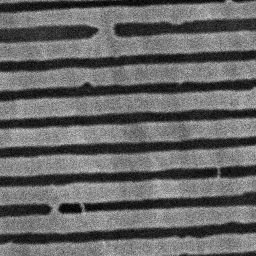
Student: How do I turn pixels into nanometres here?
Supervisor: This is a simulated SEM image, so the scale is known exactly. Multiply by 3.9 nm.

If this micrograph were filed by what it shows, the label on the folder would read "parallel lines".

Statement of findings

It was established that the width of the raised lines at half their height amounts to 75.9 nanometres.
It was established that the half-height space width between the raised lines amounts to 38 nanometres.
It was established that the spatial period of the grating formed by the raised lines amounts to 114 nm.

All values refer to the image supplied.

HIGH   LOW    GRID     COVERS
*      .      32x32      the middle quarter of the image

..............******************
********************************
********************************
********************************
******************************..
****...*........................
................................
................*********.******
********************************
********************************
********************************
*******************************.
**********......................
................................
........................********
..***..*************************
********************************
********************************
********************************
**********************..........
................................
...............................*
.........***..**.***************
********************************
********************************
********************************
************************........
.*..............................
................................
............**...***************
********************************
********************************